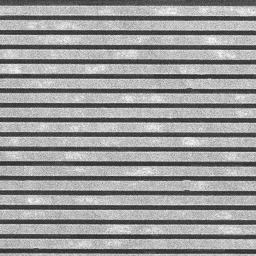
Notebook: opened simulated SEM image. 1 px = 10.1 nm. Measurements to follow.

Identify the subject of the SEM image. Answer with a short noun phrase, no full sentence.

parallel lines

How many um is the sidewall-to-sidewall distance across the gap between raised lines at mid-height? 0.0455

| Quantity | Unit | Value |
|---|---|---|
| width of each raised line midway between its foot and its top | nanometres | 99.9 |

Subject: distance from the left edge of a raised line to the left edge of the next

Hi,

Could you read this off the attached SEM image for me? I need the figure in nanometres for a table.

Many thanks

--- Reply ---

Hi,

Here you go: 147